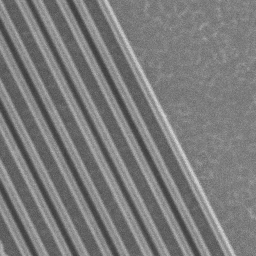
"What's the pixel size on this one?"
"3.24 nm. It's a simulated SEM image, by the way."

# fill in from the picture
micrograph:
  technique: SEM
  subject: parallel lines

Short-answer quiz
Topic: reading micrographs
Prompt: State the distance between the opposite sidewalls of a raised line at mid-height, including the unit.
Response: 23.5 nm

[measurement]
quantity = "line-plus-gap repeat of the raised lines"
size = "59.4 nanometres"